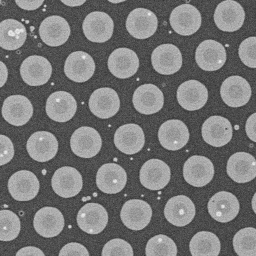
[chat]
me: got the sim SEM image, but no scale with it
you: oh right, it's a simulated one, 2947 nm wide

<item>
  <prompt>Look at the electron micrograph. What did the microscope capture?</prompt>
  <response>an array of small figures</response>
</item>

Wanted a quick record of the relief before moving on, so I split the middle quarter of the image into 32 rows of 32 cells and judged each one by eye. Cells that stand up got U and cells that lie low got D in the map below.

UUUUUUUUDDDUUUUUUUUDDDUUUUUUUDDD
UUUUUUUUDDDUUUUUUUDDDDDUUUUUDDDD
UUUUUUUDDDDDUUUUUUDDDDDDDUDDDDDD
DUUUUUDDDDDDDDDDDDDDDDDDDDDDDDDD
DDDDDDDDDDDDDDDDDDDDDDDDDDDDDDUU
DDDDDDDDDDDDDDDDDDDUUUUDDDDDDUUU
DDDDDDDDUUUUDDDDDDUUUUUUDDDDUUUU
UDDDDDDUUUUUUDDDDUUUUUUUUDDDUUUU
UUDDDDDUUUUUUUDDDUUUUUUUUDDDUUUU
UUUDDDUUUUUUUUDDDUUUUUUUUDDDDUUU
UUUDDDUUUUUUUUDDDDUUUUUUUDDDDUUU
UUUDDDDUUUUUUDDDDDUUUUUUDDDDDDDU
UUUDDDDUUUUUUDDDDDDDDDDDDDDDDDDD
UUDDDDDDDUUDDDDDDDDDDDDDDDDDDDDD
DDDDDDDDDDDDDDDDDDDDDDDDDUUUUUDD
DDDDDDDDDDDDDDDUUUUDDDDDUUUUUUDD
DDDUUUUUDDDDDUUUUUUDDDDDUUUUUUUD
DDUUUUUUUDDDDUUUUUUUDDDDUUUUUUUD
DDUUUUUUUDDDDUUUUUUUDDDDUUUUUUUD
DDUUUUUUUDDDDUUUUUUUDDDDUUUUUUUD
DDUUUUUUUDDDDUUUUUUUDDDDDUUUUUDD
DDUUUUUUUDDDDDUUUUUDDDDDDDDDDDDD
DDDUUUUUDDDDDDDDDDDDDDDDDDDDDDDD
DDDDDDDDDDDDDDDDDDDDDDDDDDDDDDDU
DDDDDDDDDDDDDDDDDDDDUUUUUDDDDDUU
DDDDDDDDDDUUUUDDDDDDUUUUUUDDDDUU
UUUDDDDDDUUUUUUDDDDUUUUUUUDDDDUU
UUUUDDDDUUUUUUUDDDDUUUUUUUDDDDUU
UUUUDDDDUUUUUUUUDDDUUUUUUUDDDDUU
UUUUDDDDUUUUUUUDDDDUUUUUUUDDDDDU
UUUUDDDDUUUUUUUDDDDDUUUUUDDDDDDD
UUUUDDDDDUUUUUDDDDDDDDDDDDDDDDDD